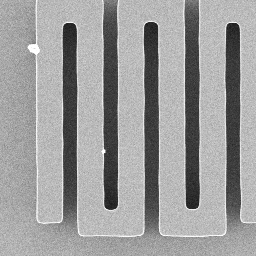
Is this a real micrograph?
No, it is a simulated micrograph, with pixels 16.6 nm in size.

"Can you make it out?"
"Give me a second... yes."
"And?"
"groups of lines, slits or small figures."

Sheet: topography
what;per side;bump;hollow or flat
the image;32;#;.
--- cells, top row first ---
.....########..########..#######
.....########..########..#######
.....########..########..#######
.....###..###..###..###..###..##
.....###..###..###..###..###..##
....####..###..###..###..###..##
....####..###..###..###..###..##
.....###..###..###..###..###..##
.....###..###..###..###..###..##
.....###..###..###..###..###..##
.....###..###..###..###..###..##
.....###..###..###..###..###..##
.....###..###..###..###..###..##
.....###..###..###..###..###..##
.....###..###..###..###..###..##
.....###..###..###..###..###..##
.....###..###..###..###..###..##
.....###..###..###..###..###..##
.....###..###..###..###..###..##
.....###..###..###..###..###..##
.....###..###..###..###..###..##
.....###..###..###..###..###..##
.....###..###..###..###..###..##
.....###..###..###..###..###..##
.....###..###..###..###..###..##
.....###..###..###..###..###..##
.....###..########..########..##
.....###..########..########..##
..........########..########....
..........##.####....#####......
................................
................................